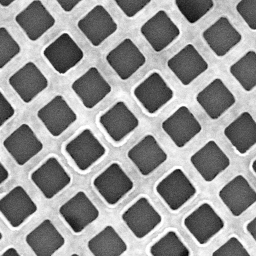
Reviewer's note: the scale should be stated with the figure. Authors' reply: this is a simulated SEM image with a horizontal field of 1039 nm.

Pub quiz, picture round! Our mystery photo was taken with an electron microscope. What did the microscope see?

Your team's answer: a regular array of holes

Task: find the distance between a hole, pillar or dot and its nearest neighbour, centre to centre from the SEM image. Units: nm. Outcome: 178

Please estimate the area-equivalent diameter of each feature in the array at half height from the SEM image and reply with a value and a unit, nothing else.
145 nm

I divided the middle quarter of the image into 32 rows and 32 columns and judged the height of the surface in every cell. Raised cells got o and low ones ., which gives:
..oooooooooo........oooooo......
.ooooo..ooooo.....ooooooooo.....
ooooo....oooo....ooooo..oooo....
oooo......oooo..ooooo...oooo....
oo.........oooooooo......oooo...
oo..........oooooo........oooooo
oo..........oooooo.........ooooo
ooo........oooooo...........oooo
oooo......oooooooo.........ooooo
.oooo....oooo..oooo.......oooooo
.oooo...oooo....oooo.....ooooooo
..ooooooooo......ooo....oooo...o
...ooooooo........ooooooooo.....
...oooooo.........oooooooo......
...oooooo..........oooooo.......
.oooooooo..........ooooo........
ooooo..ooo........ooooooo.......
oooo...oooo.....oooooooooo......
oo......oooo...ooooo...oooo.....
o........oooo.ooooo....oooo....o
..........ooooooo.......oooo..oo
..........oooooo.........ooooooo
o.........oooooo..........oooooo
oo.......ooooooo..........oooooo
ooo.....ooooooooo........ooooooo
ooo....oooo...oooo......oooooooo
oooo..oooo.....oooo....oooo..ooo
.oooooooo.......ooo...oooo....oo
..oooooo........ooooooooo......o
.oooooo..........ooooooo........
.ooooooo.........oooooo.........
oooooooo.........oooooo.........